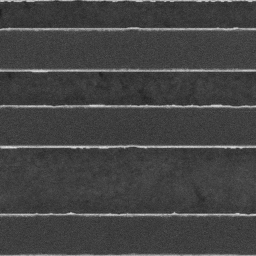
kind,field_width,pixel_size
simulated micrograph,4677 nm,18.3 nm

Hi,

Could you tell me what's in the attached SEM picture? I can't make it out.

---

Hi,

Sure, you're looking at lines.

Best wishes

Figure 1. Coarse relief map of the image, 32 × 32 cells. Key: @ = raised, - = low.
--------------------------------
--------------------------------
--------------------------------
----------------@@--------------
@@@@@@@@@@@@@@@@@@@@@@@@@@@@@@@@
@@@@@@@@@@@@@@@@@@@@@@@@@@@@@@@@
@@@@@@@@@@@@@@@@@@@@@@@@@@@@@@@@
@@@@@@@@@@@@@@@@@@@@@@@@@@@@@@@@
@@@@@@@@@@@@@@@@@@@@@@@@@@@@@@@@
--------------------------------
--------------------------------
--------------------------------
--------------------------------
@@@@@@@@@@@@@@@@@@@@@@@@@@@@@@@@
@@@@@@@@@@@@@@@@@@@@@@@@@@@@@@@@
@@@@@@@@@@@@@@@@@@@@@@@@@@@@@@@@
@@@@@@@@@@@@@@@@@@@@@@@@@@@@@@@@
@@@@@@@@@@@@@@@@@@@@@@@@@@@@@@@@
--------------------------------
--------------------------------
--------------------------------
--------------------------------
--------------------------------
--------------------------------
--------------------------------
--------------------------------
--------------------------------
@@@@@@@@@@@@@@@@@@@@@@@@@@@@@@@@
@@@@@@@@@@@@@@@@@@@@@@@@@@@@@@@@
@@@@@@@@@@@@@@@@@@@@@@@@@@@@@@@@
@@@@@@@@@@@@@@@@@@@@@@@@@@@@@@@@
@@@@@@@@@@@@@@@@@@@@@@@@@@@@@@@@